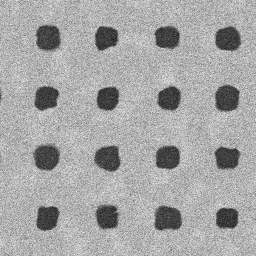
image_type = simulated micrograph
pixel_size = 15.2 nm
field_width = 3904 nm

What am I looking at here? a regular array of holes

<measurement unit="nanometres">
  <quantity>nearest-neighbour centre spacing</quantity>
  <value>900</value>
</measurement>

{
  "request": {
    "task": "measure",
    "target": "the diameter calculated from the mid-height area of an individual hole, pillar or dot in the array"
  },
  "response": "0.367 µm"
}